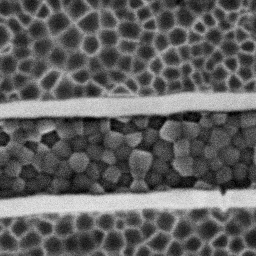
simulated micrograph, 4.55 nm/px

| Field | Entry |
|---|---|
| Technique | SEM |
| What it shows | one or a few lines or trenches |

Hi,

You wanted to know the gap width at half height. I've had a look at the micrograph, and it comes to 451 nm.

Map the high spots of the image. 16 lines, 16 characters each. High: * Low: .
****************
****************
****************
****************
****************
****************
**********......
................
................
................
................
................
................
****************
****************
****************